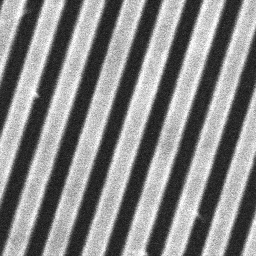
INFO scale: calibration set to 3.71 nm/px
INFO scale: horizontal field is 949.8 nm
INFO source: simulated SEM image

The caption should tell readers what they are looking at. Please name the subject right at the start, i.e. parallel lines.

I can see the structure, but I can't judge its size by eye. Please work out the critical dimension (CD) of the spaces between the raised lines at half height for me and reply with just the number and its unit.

0.0648 µm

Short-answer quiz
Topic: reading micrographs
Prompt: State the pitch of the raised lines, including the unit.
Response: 141 nanometres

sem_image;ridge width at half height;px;20.5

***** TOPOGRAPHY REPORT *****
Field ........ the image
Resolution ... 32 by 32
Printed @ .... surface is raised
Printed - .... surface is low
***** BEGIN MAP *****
@@@--@@@--@@@--@@@--@@@--@@@--@@
@@@--@@@--@@@--@@@--@@@--@@@--@@
@@@--@@---@@---@@---@@---@@---@@
@@--@@@--@@@--@@@--@@@--@@@--@@@
@@--@@@--@@@--@@@--@@@--@@@--@@@
@---@@---@@@--@@---@@---@@---@@-
@---@@--@@@--@@@--@@@--@@@--@@@-
@--@@@--@@@--@@@--@@@--@@@--@@@-
@--@@---@@---@@---@@---@@---@@--
---@@--@@@--@@@--@@@--@@@--@@@--
--@@@--@@@--@@@--@@@--@@@--@@@--
--@@@--@@---@@---@@@--@@---@@---
--@@--@@@--@@@--@@@--@@@--@@@--@
-@@@--@@@--@@@--@@@--@@@--@@@--@
-@@@--@@@--@@@--@@@--@@---@@---@
-@@---@@---@@--@@@--@@@--@@@--@@
@@@--@@@--@@@--@@@--@@@--@@@--@@
@@@--@@@--@@@--@@@--@@@--@@---@@
@@---@@---@@--@@@---@@--@@@--@@@
@@--@@@--@@@--@@@--@@@--@@@--@@@
@@--@@@--@@@--@@@--@@@--@@@--@@@
@---@@---@@---@@---@@---@@---@@-
@--@@@--@@@--@@@--@@@--@@@--@@@-
@--@@@--@@@--@@@--@@@--@@@--@@@-
---@@---@@---@@---@@---@@---@@--
--@@@--@@@--@@@--@@@--@@@--@@@--
--@@@--@@@--@@@--@@@--@@@--@@@--
--@@---@@---@@---@@---@@---@@---
-@@@--@@@--@@@--@@@--@@@--@@@--@
-@@@--@@@--@@@--@@@--@@@--@@@--@
-@@@--@@---@@---@@---@@---@@---@
@@@--@@@--@@@--@@@--@@@--@@@--@@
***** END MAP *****